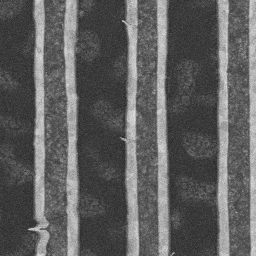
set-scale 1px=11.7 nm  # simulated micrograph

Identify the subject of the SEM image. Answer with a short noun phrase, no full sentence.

one or a few lines or trenches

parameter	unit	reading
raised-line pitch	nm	1070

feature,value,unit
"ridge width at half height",348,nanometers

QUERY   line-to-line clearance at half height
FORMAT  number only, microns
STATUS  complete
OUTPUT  0.725